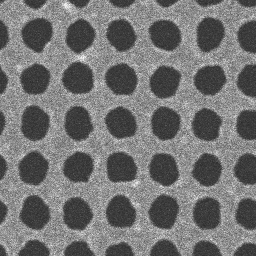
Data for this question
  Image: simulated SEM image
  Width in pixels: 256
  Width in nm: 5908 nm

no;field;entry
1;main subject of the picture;a regular array of holes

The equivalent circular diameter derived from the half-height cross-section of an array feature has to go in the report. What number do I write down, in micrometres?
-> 0.746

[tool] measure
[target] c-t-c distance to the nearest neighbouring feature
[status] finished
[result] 42.7 pixels